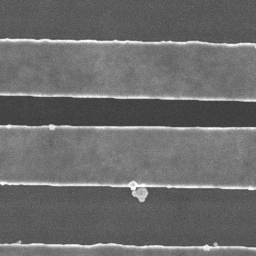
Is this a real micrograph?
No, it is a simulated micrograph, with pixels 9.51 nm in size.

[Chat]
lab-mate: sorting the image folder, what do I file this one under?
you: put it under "lines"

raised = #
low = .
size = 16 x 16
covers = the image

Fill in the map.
................
................
####............
################
################
################
................
................
################
################
################
################
................
................
................
################